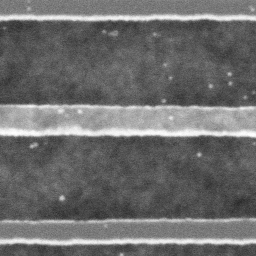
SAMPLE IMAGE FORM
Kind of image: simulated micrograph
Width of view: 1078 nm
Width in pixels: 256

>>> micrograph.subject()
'lines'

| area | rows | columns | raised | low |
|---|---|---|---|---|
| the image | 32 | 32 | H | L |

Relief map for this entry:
HHHHHHHHHHHHHHHHHHHHHHHHHHHHHHHH
HHHHHHHHHHHHHHHHHHHHHHHHHHHHHHHH
LLLLLLLLLLLLLLLLLLLLLLLLLLLLLLLL
LLLLLLLLLLLLLLLLLLLLLLLLLLLLLLLL
LLLLLLLLLLLLLLLLLLLLLLLLLLLLLLLL
LLLLLLLLLLLLLLLLLLLLLLLLLLLLLLLL
LLLLLLLLLLLLLLLLLLLLLLLLLLLLLLLL
LLLLLLLLLLLLLLLLLLLLLLLLLLLLLLLL
LLLLLLLLLLLLLLLLLLLLLLLLLLLLLLLL
LLLLLLLLLLLLLLLLLLLLLLLLLLLLLLLL
LLLLLLLLLLLLLLLLLLLLLLLLLLLLLLLL
LLLLLLLLLLLLLLLLLLLLLLLLLLLLLLLL
LLLLLLLLLLLLLLLLLLLLLLLLLLLLLLLL
HHHHHHHHHHHHHHHHHHHHHHHHHHHHHLHH
HHHHHHHHHHHHHHHHHHHHHHHHHHHHHHHH
HHHHHHHHHHHHHHHHHHHHHHHHHHHHHHHH
HHHHHHHHHHHHHHHHHHHHHHHHHHHHHHHH
LLLLLLLLLLLLLLLLLLLLLLLLLLLLLLLL
LLLLLLLLLLLLLLLLLLLLLLLLLLLLLLLL
LLLLLLLLLLLLLLLLLLLLLLLLLLLLLLLL
LLLLLLLLLLLLLLLLLLLLLLLLLLLLLLLL
LLLLLLLLLLLLLLLLLLLLLLLLLLLLLLLL
LLLLLLLLLLLLLLLLLLLLLLLLLLLLLLLL
LLLLLLLLLLLLLLLLLLLLLLLLLLLLLLLL
LLLLLLLLLLLLLLLLLLLLLLLLLLLLLLLL
LLLLLLLLLLLLLLLLLLLLLLLLLLLLLLLL
LLLLLLLLLLLLLLLLLLLLLLLLLLLLLLLL
LLLLLLLLLLLLLLLLLLLLLLLLLLLLLLHH
HHHHHHHHHHHHHHHHHHHHHHHHHHHHHHHH
HHHHHHHHHHHHHHHHHHHHHHHHHHHHHHHH
LLLLLLLLLLLLLLLLLLLLLLLLLLLLLLLL
LLLLLLLLLLLLLLLLLLLLLLLLLLLLLLLL